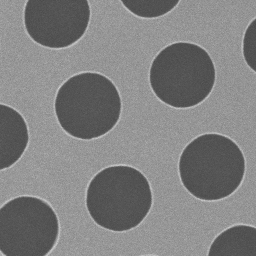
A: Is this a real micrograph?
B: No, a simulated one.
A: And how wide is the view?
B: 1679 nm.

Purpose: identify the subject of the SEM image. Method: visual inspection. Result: holes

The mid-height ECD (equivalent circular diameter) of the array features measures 432 nanometres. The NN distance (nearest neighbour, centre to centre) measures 637 nanometers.